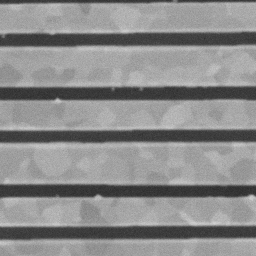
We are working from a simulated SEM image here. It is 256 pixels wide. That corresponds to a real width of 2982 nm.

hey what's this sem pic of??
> lines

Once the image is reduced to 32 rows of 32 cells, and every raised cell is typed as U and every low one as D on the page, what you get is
DDUUUDUUUUUUUUUUUUUUUUUUUUUUUUUU
UUUUUUUUUUUUUUUUUUUUUUUUUUUUUUUU
UUUUUUUUUUUUUUUUUUUUUUUUUUUUUUUU
UUUUUUUUUUUUUUUUUUUUUUUUUUUUUUUU
DDDDDDDDDDDDDDDDDDDDDDDDDDDDDDDD
DDDDDDDDDDDDDDDDDDDDDDDDDDDDDDDD
UUUUUUUUUUUUUUUUUUUUUUUUUUUUUUUU
UUUUUUUUUUUUUUUUUUUUUUUUUUUUUUUU
UUUUUUUUUUUUUUUUUUUUUUUUUUUUUUUU
UUUUUUUUUUUUUUUUUUUUUUUUUUUUUUUU
UUUUUUUUUUUUUUUUUUUUUUUUUUUUUUUU
DDDDDDDDDDDDDDDDDDDDDDDDDDDDDDDD
DDDDDDDUDDDDDDDDDDDDDDDDDDDDDDDD
UUUUUUUUUUUUUUUUUUUUUUUUUUUUUUUU
UUUUUUUUUUUUUUUUUUUUUUUUUUUUUUUU
UUUUUUUUUUUUUUUUUUUUUUUUUUUUUUUU
DDDDDDDDDDDDDDDDDDDDDDDDDDDDDDDD
DDDDDDDDDDDDDDDDDDDDDDDDDDDDDDDD
UUUUUUUUUUUUUUUUUUUUUUUUUUUUUUUU
UUUUUUUUUUUUUUUUUUUUUUUUUUUUUUUU
UUUUUUUUUUUUUUUUUUUUUUUUUUUUUUUU
UUUUUUUUUUUUUUUUUUUUUUUUUUUUUUUU
UUUUUUUUUUUUUUUUUUUUUUUUUUUUUUUU
DDDDDDDDDDDDDDDDDDDDDDDDDDDDDDDD
DDDDDDDDDDDDDDDDDDDDDDDDDDDDDDDU
UUUUUUUUUUUUUUUUUUUUUUUUUUUUUUUU
UUUUUUUUUUUUUUUUUUUUUUUUUUUUUUUU
UUUUUUUUUUUUUUUUUUUUUUUUUUUUUUUU
DDDDDDDDDDDDDDDDDDDDDDDDDDDDDDDD
DDDDDDDDDDDDDDDDDDDDDDDDDDDDDDDD
UUUUUUUUUUUUUUUUUUUUUUUUUUUUUUUU
UUUUUUUUUUUUUUUUUUUUUUUUUUUUUUUU